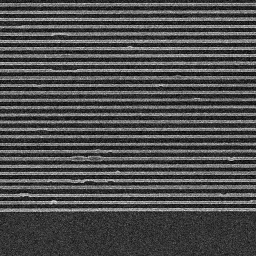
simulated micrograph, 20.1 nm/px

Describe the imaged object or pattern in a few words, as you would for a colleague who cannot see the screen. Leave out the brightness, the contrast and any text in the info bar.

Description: parallel lines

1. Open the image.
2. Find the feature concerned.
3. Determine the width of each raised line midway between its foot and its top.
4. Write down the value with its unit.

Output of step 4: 52.6 nanometres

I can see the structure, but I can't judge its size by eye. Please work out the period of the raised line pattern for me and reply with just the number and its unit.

147 nm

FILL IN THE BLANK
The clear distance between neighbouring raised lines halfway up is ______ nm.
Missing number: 87.7